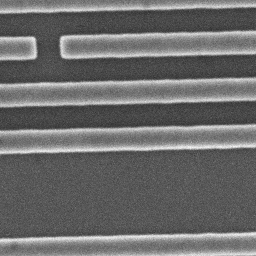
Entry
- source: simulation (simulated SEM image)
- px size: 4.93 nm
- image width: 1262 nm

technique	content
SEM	groups of lines, slits or small figures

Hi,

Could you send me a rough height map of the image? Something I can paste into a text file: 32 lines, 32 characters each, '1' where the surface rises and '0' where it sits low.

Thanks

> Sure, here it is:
11111111111111111111111111111111
11000000000000000000000000000000
00000000000000000000000000000000
00000000000000000000000000000000
00000000011111111111111111111111
11110000111111111111111111111111
11110000111111111111111111111111
00000000000000000000000000000000
00000000000000000000000000000000
00000000000000000000000000000000
00011111111111111111111111111111
11111111111111111111111111111111
11111111111111111111111111111100
00000000000000000000000000000000
00000000000000000000000000000000
00000000000000000000000000000000
11111111111111111111111111111111
11111111111111111111111111111111
11111111111111111111111110000000
00000000000000000000000000000000
00000000000000000000000000000000
00000000000000000000000000000000
00000000000000000000000000000000
00000000000000000000000000000000
00000000000000000000000000000000
00000000000000000000000000000000
00000000000000000000000000000000
00000000000000000000000000000000
00000000000000000000000000000000
00000000000000001111111111111111
11111111111111111111111111111111
11111111111111111111111111111111